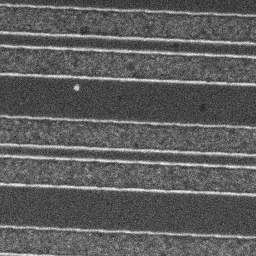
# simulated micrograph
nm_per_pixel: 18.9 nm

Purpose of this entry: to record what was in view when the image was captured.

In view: lines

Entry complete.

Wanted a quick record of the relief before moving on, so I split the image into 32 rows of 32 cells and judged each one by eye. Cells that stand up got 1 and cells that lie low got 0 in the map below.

11111111111111111111111111111111
00000000000000000000011111111111
00000000000000000000000000000000
00000000000000000000000000000000
11111111110000000000000000000000
11111111111111111111111111111111
00000000000000000111111111111111
00000000000000000000000000000000
00000000000000000000000000000000
11111000000000000000000000000000
11111111111111111111111111111111
11111111111111111111111111111111
11111111111111111111111111111111
11111111111111111111111111111111
11111111111111111111111111111111
00000000000000000000001111111111
00000000000000000000000000000000
00000000000000000000000000000000
11111111111000000000000000000000
11111111111111111111111111111111
00000000000000000000111111111111
00000000000000000000000000000000
00000000000000000000000000000000
11111111111100000000000000000000
11111111111111111111111111111111
11111111111111111111111111111111
11111111111111111111111111111111
11111111111111111111111111111111
00001111111111111111111111111111
00000000000000000000000000011111
00000000000000000000000000000000
00000000000000000000000000000000